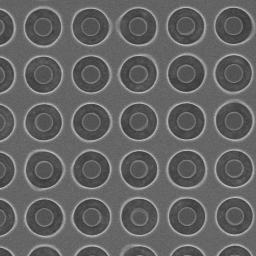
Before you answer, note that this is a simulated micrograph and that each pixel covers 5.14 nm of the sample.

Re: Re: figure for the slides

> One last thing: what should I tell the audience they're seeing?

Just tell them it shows an array of small figures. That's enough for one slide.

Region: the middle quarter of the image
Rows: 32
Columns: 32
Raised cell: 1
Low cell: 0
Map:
11100000000111000000000111000010
11000111100111000111100111000111
11000111100011001111100111001111
11000111100011000111100111000111
11000011000111000010000111000011
11100000001111100000001111100000
11110000011111110000011111111000
11111111111111111111111111111111
11111111111111111111111111111111
11111111111111111111111111111111
11110000011111110000011111110000
11100000000111100000001111100000
11100011000111000011000111000111
11000111100011000111100111000111
11000111100011000111100111001111
11000111100011000111000111000111
11100011000111100000000111000000
11100000001111100000001111100000
11110000011111110000011111111000
11111111111111111111111111111111
11111111111111111111111111111111
11111111111111111111111111111111
11111000011111110000011111110000
11100000001111100000001111100000
11100011000111000011000111000111
11000111100111000111000111000111
11000111100011000111100111000111
11000111100111000111000111000111
11100000000111100010000111000000
11100000001111100000001111100000
11110000011111111000011111111000
11111111111111111111111111111111